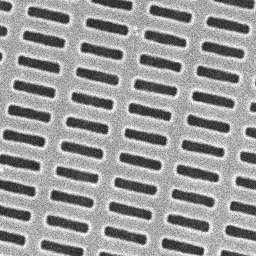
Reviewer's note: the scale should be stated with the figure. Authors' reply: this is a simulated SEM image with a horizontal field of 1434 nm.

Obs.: a regular array of holes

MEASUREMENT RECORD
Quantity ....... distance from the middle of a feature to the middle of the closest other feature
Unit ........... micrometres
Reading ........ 0.14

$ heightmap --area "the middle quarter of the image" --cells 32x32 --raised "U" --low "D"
UUUUUUUUUUUUUUUUUUUUUDDDDDDDDDUU
UUUDDDDDUUUUUUUUUUUUUUUUUUDDDUUU
UUUDDDDDDDDDUUUUUUUUUUUUUUUUUUUU
UUUUDDDDDDDDDDUUUUUUUUUUUUUUUUUU
UUUUUUUUDDDDDDUUUDDDDDDUUUUUUUUU
UUUUUUUUUUUUUUUUUDDDDDDDDDDDUUUU
UUUUUUUUUUUUUUUUUUUDDDDDDDDDUUUU
UUDDDDUUUUUUUUUUUUUUUUUDDDDDUUUU
UUDDDDDDDDDUUUUUUUUUUUUUUUUUUUUU
UUDDDDDDDDDDDUUUUUUUUUUUUUUUUUUU
UUUUUUDDDDDDUUUUDDDDDUUUUUUUUUUU
UUUUUUUUUUUDUUUUDDDDDDDDDUUUUUUU
UUUUUUUUUUUUUUUUUDDDDDDDDDDUUUUU
UDDDUUUUUUUUUUUUUUUUUUDDDDDUUUUD
DDDDDDDDUUUUUUUUUUUUUUUUUUUUUUUD
UDDDDDDDDDDUUUUUUUUUUUUUUUUUUUUU
UUUUDDDDDDDUUUUDDDUUUUUUUUUUUUUU
UUUUUUUUUDDUUUUDDDDDDDDDUUUUUUUU
UUUUUUUUUUUUUUUDDDDDDDDDDDUUUUUU
DDUUUUUUUUUUUUUUUUUDDDDDDDUUUDDD
DDDDDDDUUUUUUUUUUUUUUUUUDDUUUDDD
DDDDDDDDDDUUUUUUUUUUUUUUUUUUUUDD
UUDDDDDDDDUUUUDDDUUUUUUUUUUUUUUU
UUUUUUUDDDUUUUDDDDDDDDUUUUUUUUUU
UUUUUUUUUUUUUUDDDDDDDDDDUUUUUUUU
UUUUUUUUUUUUUUUUUDDDDDDDDUUUDDDD
DDDDUUUUUUUUUUUUUUUUUUDDUUUUDDDD
DDDDDDDDUUUUUUUUUUUUUUUUUUUUDDDD
DDDDDDDDDUUUUDDUUUUUUUUUUUUUUUUD
UUUUDDDDDUUUDDDDDDDUUUUUUUUUUUUU
UUUUUUUUUUUUUDDDDDDDDDDUUUUUUUUU
UUUUUUUUUUUUUUUDDDDDDDDUUUUDDDUU